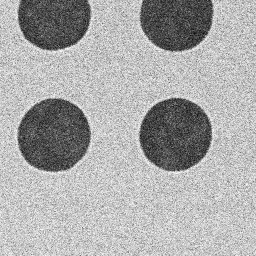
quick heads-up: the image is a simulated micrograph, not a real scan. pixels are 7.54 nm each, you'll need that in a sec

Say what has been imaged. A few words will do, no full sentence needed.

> holes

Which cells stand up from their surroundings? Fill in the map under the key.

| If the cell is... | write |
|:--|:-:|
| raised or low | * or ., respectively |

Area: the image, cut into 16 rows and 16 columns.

*.....***....***
*.....***....***
**...****....***
****************
****************
****************
**...*****..****
*....****....***
*.....***....***
*....****....***
**..******..****
****************
****************
****************
****************
****************